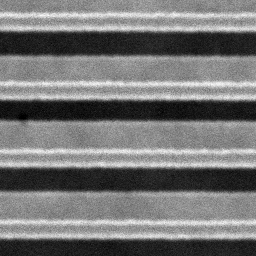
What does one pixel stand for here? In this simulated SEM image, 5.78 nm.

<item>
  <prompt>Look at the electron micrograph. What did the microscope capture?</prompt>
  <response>lines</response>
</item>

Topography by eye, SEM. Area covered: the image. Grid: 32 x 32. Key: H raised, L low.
HHHHHHHHHHHHHHHHHHHHHHHHHHHHHHHH
HHHHHHHHHHHHHHHHHHHHHHHHHHHHHHHH
HHHHHHHHHHHHHHHHHHHHHHHHHHHHHHHH
HHHHHHHHHHHHHHHHHHHHHHHHHHHHHHHH
LLLLLLLLLLLLLLLLLLLLLLLLLLLLLLLL
LLLLLLLLLLLLLLLLLLLLLLLLLLLLLLLL
LLLLLLLLLLLLLLLLLLLLLLLLLLLLLLLL
HHHHHHHHHHHHHHHHHHHHHHHHHHHHHHHH
HHHHHHHHHHHHHHHHHHHHHHHHHHHHHHHH
HHHHHHHHHHHHHHHHHHHHHHHHHHHHHHHH
HHHHHHHHHHHHHHHHHHHHHHHHHHHHHHHH
HHHHHHHHHHHHHHHHHHHHHHHHHHHHHHHH
LLLLLLLLLLLLLLLLLLLLLLLLLLLLLLLL
LLLLLLLLLLLLLLLLLLLLLLLLLLLLLLLL
LLLLLLLLLLLLLLLLLLLLLLLLLLLLLLLL
HHHHHHHHHHHHHHHHHHHHHHHHHHHHHHHH
HHHHHHHHHHHHHHHHHHHHHHHHHHHHHHHH
HHHHHHHHHHHHHHHHHHHHHHHHHHHHHHHH
HHHHHHHHHHHHHHHHHHHHHHHHHHHHHHHH
HHHHHHHHHHHHHHHHHHHHHHHHHHHHHHHH
HHHHHHHHHHHHHHHHHHHHHHHHHHHHHHHH
LLLLLLLLLLLLLLLLLLLLLLLLLLLLLLLL
LLLLLLLLLLLLLLLLLLLLLLLLLLLLLLLL
LLLLLLLLLLLLLLLLLLLLLLLLLLLLLLLL
HHHHHHHHHHHHHHHHHHHHHHHHHHHHHHHH
HHHHHHHHHHHHHHHHHHHHHHHHHHHHHHHH
HHHHHHHHHHHHHHHHHHHHHHHHHHHHHHHH
HHHHHHHHHHHHHHHHHHHHHHHHHHHHHHHH
HHHHHHHHHHHHHHHHHHHHHHHHHHHHHHHH
HHHHHHHHHHHHHHHHHHHHHHHHHHHHHHHH
LLLLLLLLLLLLLLLLLLLLLLLLLLLLLLLL
LLLLLLLLLLLLLLLLLLLLLLLLLLLLLLLL